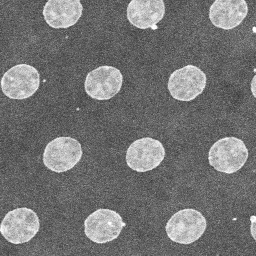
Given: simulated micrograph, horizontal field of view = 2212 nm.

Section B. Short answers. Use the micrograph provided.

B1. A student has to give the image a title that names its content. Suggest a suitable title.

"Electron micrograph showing a regular array of raised bodies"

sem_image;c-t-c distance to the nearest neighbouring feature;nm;713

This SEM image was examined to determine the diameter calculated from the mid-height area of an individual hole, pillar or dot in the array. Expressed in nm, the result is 309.